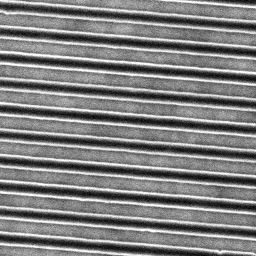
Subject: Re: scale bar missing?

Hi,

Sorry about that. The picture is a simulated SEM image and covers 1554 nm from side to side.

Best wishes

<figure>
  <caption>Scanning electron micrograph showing parallel lines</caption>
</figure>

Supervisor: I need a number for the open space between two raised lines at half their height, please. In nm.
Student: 79.4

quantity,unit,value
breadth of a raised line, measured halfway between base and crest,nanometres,74.1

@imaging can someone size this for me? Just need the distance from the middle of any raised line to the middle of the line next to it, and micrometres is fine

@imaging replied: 0.156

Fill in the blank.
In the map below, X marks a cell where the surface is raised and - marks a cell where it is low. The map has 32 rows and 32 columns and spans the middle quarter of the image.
XXXXXXXXXXXXXXXXXXXXXXXXXXX-----
--XXXXXXXXXXXXXXXXXXXXXXXXXXXXXX
--------------XXXXXXXXXXXXXXXXXX
--------------------------XXXXXX
--------------------------------
XXXXXXXXXX----------------------
XXXXXXXXXXXXXXXXXXXXX-----------
XXXXXXXXXXXXXXXXXXXXXXXXXXXXXXXX
---------XXXXXXXXXXXXXXXXXXXXXXX
--------------------XXXXXXXXXXXX
--------------------------------
XXXXX---------------------------
XXXXXXXXXXXXXXXXX---------------
XXXXXXXXXXXXXXXXXXXXXXXXXXXXX---
----XXXXXXXXXXXXXXXXXXXXXXXXXXXX
----------------XXXXXXXXXXXXXXXX
----------------------------X-XX
--------------------------------
XXXXXXXXXX----------------------
XXXXXXXXXXXXXXXXXXXXXX----------
XXXXXXXXXXXXXXXXXXXXXXXXXXXXXXXX
------------XXXXXXXXXXXXXXXXXXXX
------------------------XXXXXXXX
--------------------------------
XXXXXXX-------------------------
XXXXXXXXXXXXXXXXXXX-------------
XXXXXXXXXXXXXXXXXXXXXXXXXXXXXX--
------XXXXXXXXXXXXXXXXXXXXXXXXXX
------------------XXXXXXXXXXXXXX
------------------------------XX
--------------------------------
XXXXXXXXXXXX--------------------